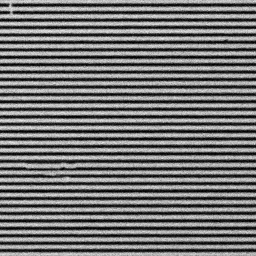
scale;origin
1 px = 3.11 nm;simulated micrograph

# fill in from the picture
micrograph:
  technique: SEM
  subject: parallel lines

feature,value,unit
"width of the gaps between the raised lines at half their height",3.38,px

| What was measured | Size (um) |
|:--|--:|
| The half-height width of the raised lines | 0.0136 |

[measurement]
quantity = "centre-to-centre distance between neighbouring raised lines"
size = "23.1 nm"